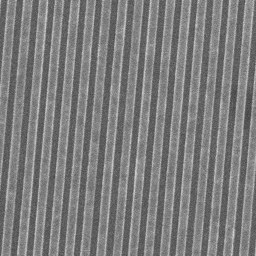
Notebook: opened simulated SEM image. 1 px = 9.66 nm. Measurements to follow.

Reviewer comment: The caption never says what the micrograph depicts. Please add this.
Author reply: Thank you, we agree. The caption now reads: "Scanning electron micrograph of parallel lines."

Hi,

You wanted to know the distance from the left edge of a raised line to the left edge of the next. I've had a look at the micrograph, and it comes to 152 nanometers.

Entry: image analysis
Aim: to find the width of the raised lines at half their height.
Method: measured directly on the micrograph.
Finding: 84.2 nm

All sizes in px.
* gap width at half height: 6.84